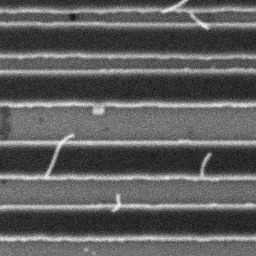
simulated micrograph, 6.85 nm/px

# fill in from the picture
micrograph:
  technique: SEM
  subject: lines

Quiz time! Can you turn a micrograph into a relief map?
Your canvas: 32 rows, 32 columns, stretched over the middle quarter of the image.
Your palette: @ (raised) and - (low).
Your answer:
--------------------------------
------------------------------@@
@@@@@@@@@@@@@@@@@@@@@@@@@@@@@@@@
@@@@@@@@@@@@@@@@@@@@@@@@@@@@@@@@
@@@@@@@@@@@@@@@@@@@@@@@@@@@@@@@@
@@@@@@@@@@@@@@@@@@@@@@@@@@@@@@@@
@@@@@@@@@@@@@@@@@@@@@@@@@@@@@@@@
@@@@@@@@@@@@@@@@@@@@@@@@@@@@@@@@
@@@@@@@@@@@@@@@@@@@@@@@@@@@@@@@@
@@@@@@@@@@@@@@@@@@@@@@@@@@@@@@@@
-------@@@---@@@@@@@---@@@@@@@@@
--------@@----------------------
--------------------------------
--------------------------------
--------------------------------
--------------------------------
--------------------------------
--------------------------------
--------------------------------
@@@@@@@@@@@@@@@@@@@@@@@@@@@@@@@@
@@@@@@@@@@@@@@@@@@@@@@@@@@@@@@@@
@@@@@@@@@@@@@@@@@@@@@@@@@@@@@@@@
@@@@@@@@@@@@@@@@@@@@@@@@@@@@@@@@
@@@@@@@@@@@@@@@@@@@@@@@@@@@@@@@@
@@@@@@@@@@@@@@@@@@@@@@@@@@@@@@@@
@@@@@@@@@@@@@@@@@@@@@@@@@@@@@@@@
@@@@@@@@@@@@@@@@@@@@@@@@@@@@@@@@
@@@@@@@@@@@@@@@@@@@@@@@@@@@@@@@@
@-@@@@@@@@@@@@@@@---@@@@@@@-@-@@
--------------------------------
--------------------------------
--------------------------------